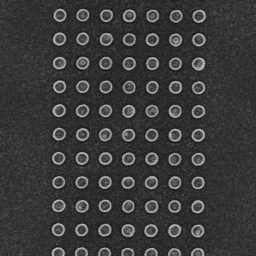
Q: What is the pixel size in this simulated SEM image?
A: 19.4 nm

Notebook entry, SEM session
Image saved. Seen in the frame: a regular array of raised bodies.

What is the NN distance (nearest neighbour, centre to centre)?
447 nm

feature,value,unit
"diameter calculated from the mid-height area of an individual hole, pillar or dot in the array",231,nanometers